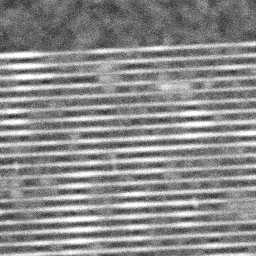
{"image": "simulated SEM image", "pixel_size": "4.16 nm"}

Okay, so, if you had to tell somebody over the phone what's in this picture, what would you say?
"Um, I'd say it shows parallel lines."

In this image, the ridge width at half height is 8.8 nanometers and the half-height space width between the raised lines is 37.9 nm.